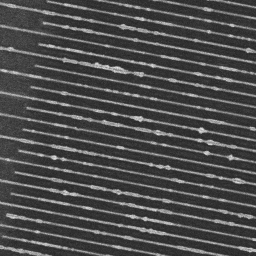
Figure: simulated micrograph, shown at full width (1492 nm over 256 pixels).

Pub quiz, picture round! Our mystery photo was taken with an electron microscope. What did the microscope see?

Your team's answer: parallel lines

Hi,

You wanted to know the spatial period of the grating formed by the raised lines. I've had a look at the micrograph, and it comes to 0.0634 micrometres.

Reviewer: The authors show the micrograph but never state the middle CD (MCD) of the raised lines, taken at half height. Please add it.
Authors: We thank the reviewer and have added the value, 15.1 nm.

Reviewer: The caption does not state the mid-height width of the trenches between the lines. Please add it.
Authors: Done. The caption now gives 51.6 nm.